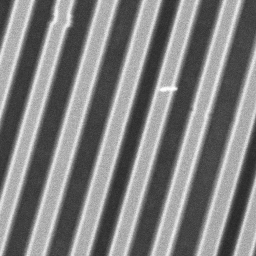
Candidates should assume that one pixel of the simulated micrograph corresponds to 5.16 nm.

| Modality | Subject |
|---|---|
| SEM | parallel lines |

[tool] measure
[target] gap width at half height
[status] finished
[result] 111 nanometers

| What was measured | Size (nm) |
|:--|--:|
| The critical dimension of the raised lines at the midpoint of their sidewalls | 102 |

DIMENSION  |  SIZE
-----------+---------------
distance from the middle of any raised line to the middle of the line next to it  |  210 nm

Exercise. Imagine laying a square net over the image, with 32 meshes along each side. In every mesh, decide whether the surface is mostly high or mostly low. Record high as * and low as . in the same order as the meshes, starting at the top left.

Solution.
..**...**...***...**..***...**..
.***...**...**...***..***..***..
.***..***..***...***..**...***..
.**...***..***...**...**...**...
***...**...***..***..***..***...
***..***...**...***..**...***...
***..***..***...**...**...**....
**...**...***...**..***...**...*
**...**...**...***..***..***...*
**..***..***...***..**...***...*
*...**...***...**...**...**....*
*...**...***..***..***...**...**
*..***...**...***..**...***...**
*..***..***...**...**...**....**
...**...***...**..***...**...***
...**...**...***..***..***...***
..***...**...***..**...***...***
..**...***...**..***...**....**.
..**...***..***..***...**...***.
.***...**...***..**...***...***.
.***..***...**...**...***...**..
.**...***...**..***...**...***..
.**...**...***..***..***...***..
***...**...***..**...***...***.*
**...***...**..***...**....**..*
**...***...**..***...**...***..*
**...**...***..**...***...***..*
**..***...**...**...***...**..**
*...***...**..***...**...***..**
*...**...***..***..***...***..**
*...**...***..**...***...***.***
*..***...**..***...**....**..***